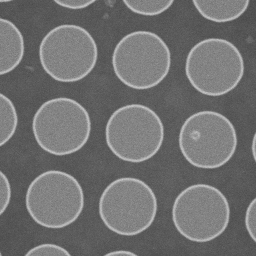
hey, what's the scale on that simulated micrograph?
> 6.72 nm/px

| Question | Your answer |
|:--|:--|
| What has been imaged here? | an array of small figures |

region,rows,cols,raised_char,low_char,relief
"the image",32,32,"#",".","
.......####.....#####...#######.
.................###.....#####..
#.........................###...
##.....###......................
###...#####.....####............
###..#######...######....####...
###..#######..#######...######..
###..#######..#######..#######..
##...#######..#######..#######..
......#####....######..#######..
................####....######..
.........................###....
#.....###.......................
##...#####.....###..............
##..#######...######....####....
##..#######..#######...######...
##..#######..#######...######...
#....######..#######..########..
.....#####....######...######...
...............####....######...
........................####....
......##........................
#...#####......##...............
#...######...######.....###.....
#..#######...######...######....
#..#######..########..######...#
....######..#######...#######..#
....#####....######...#######..#
..............####....######...#
.......................####....#
................................
....####......##................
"